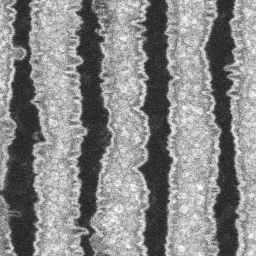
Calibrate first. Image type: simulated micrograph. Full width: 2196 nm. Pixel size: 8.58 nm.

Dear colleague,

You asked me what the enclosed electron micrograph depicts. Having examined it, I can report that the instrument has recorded one or a few lines or trenches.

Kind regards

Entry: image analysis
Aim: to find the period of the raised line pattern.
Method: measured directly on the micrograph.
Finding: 578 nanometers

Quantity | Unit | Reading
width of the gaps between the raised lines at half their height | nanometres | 333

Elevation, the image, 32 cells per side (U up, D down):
DUUUDDDDDDUUDDDDDDUUUDDDDDUUUUDD
DUUUDDDDDUUUUDDDDDUUUDDDDDDUUUDD
DDUUDDDDDUUUUDDDDUUUUDDDDDUUUDDD
DUUUDDDDDUUUUDDDDDUUUDDDDDUUUDDD
DUUUDDDDDUUUUDDDDUUUUDDDDDUUUDDD
DUUUDDDDDUUUUDDDDUUUUDDDDUUUUUDD
DDDUDDDDDUUUUDDDDDUUUDDDDUUUUUDD
DUUUDDDDDDUUUDDDDDUUUDDDDDUUUUDD
DUUUDDDDDUUUUDDDDDUUUDDDDDUUUDDD
DUUUDDDDDUUUUDDDDDUUUUDDDDUUUDDD
DUUUUDDDDDUUUDDDDDUUUDDDDDUUUDDD
DUUUUDDDDDUUUDDDDDUUUDDDDDUUUDDD
DUUUUDDDDDUUUDDDDDUUUDDDDDUUUDDD
DUUUUDDDDDUUUUDDDUUUUUDDDDUUUDDD
UUUUUDDDDDUUUUDDDDUUUDDDDDUUUUDD
DUUUUDDDDDUUUUDDDDUUUUDDDDDUUDDD
DUUUUUDDDDUUUUDDDDUUUUDDDDDUUDDD
DUUUUUDDDDUUUUDDDDUUUDDDDDDUUUDD
UUUUUDDDDDUUUUDDDDUUUDDDDDDUUUDD
DUUUUDDDDUUUUDDDDDUUUUDDDDDUUUDD
UUUUUDDDDUUUUDDDDUUUUUDDDDDUUUDD
UUUUUDDDDUUUUDDDDUUUUDDDDDDUUUDD
UUUUUDDDDUUUUDDDDDUUUDDDDDUUUUDD
UUUUUDDDDDUUUDDDDDUUUUDDDDDUUUDD
UUUUUDDDDUUUUDDDDDUUUUDDDDUUUUDD
UUUUUDDDDUUUUDDDDDUUUUDDDDUUUUDD
DUUUUDDDDUUUDDDDDDUUUDDDDDUUUUDD
DUUUUDDDDUUUDDDDDDUUUDDDDDDUUUDD
DUUUUDDDDUUUDDDDDDUUUDDDDDDUUUDD
DUUUUDDDDDUUDDDDDUUUUDDDDDUUUUDD
DUUUUDDDDUUUDDDDDUUUUDDDDDUUUUDD
DUUUUDDDDDUUUDDDDDUUUDDDDDDUUUDD